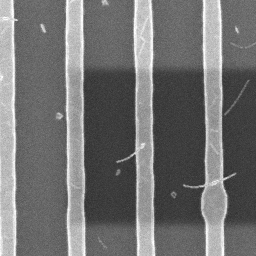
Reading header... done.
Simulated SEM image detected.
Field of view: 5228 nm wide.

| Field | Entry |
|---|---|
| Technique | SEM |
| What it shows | wiring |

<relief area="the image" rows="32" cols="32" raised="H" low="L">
HHLLLLLLHHLLLLLLLHHLLLLLLHHLLLLL
HHLLLLLLHHLLLLLLLHHLLLLLLHHHLLLL
HHLLLLLLHHLLLLLLLHHLLLLLLHHHLLLL
HHLLLLLLHHLLLLLLLHHLLLLLLHHHLLLL
HHLLLLLLHHLLLLLLLHHLLLLLLHHHLLLL
HHLLLLLLHHLLLLLLLHHLLLLLLHHHLLLL
HHLLLLLLHHLLLLLLLHHLLLLLLHHHLLLL
HHLLLLLLHHLLLLLLLHHLLLLLLLHHLLLL
HHLLLLLLHHLLLLLLLHHLLLLLLLHHLLLL
HHLLLLLLHHLLLLLLLHHLLLLLLLHHLLLL
HHLLLLLLHHLLLLLLLHHLLLLLLLHHLLLL
HHLLLLLLHHLLLLLLLHHLLLLLLLHHLLLL
HHLLLLLLHHLLLLLLLHHLLLLLLLHHLLLL
HHLLLLLLHHLLLLLLLHHLLLLLLLHHLLLL
HHLLLLLLHHLLLLLLLHHLLLLLLLHHLLLL
HHLLLLLLHHLLLLLLLHHLLLLLLLHHLLLL
HHLLLLLLHHLLLLLLLHHLLLLLLLHHLLLL
HHLLLLLLHHLLLLLLLHHLLLLLLLHHLLLL
HHLLLLLLHHLLLLLLLHHLLLLLLLHHLLLL
HHLLLLLLHHLLLLLLLHHLLLLLLLHHLLLL
HHLLLLLLLHLLLLLLLHHLLLLLLLHHLLLL
HHLLLLLLHHHLLLLLLHHLLLLLLLHHLLLL
HHLLLLLLHHHLLLLLLHHLLLLLLLHHLLLL
HHLLLLLLLHHLLLLLLHHLLLLLLLHHLLLL
HHLLLLLLLHHLLLLLLHHLLLLLLHHHLLLL
HHLLLLLLLHLLLLLLLHHLLLLLLHHHLLLL
HHLLLLLLHHLLLLLLLHHLLLLLLHHHLLLL
HHLLLLLLHHHLLLLLLHHLLLLLLLHHLLLL
HHLLLLLLHHHLLLLLLHHLLLLLLLHHLLLL
HHLLLLLLLHHLLLLLLHHLLLLLLLHHLLLL
HHLLLLLLLHHLLLLLLHHLLLLLLLHHLLLL
HHLLLLLLLHHLLLLLLHHLLLLLLLHHLLLL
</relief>